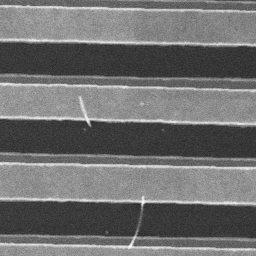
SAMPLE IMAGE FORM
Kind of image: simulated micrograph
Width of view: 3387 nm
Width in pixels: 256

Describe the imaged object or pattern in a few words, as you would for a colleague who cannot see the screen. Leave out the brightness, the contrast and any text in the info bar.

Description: lines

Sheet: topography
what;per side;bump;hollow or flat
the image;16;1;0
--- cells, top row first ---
1111111111111111
1111111111111111
1111111111111111
0000000000000000
0000000000000000
1111111111111111
1111111111111111
0000011111111111
0000000000000000
0000000000000000
1111111111111111
1111111111111111
0011111111111111
0000000000000000
0000000000000000
1111111111111111